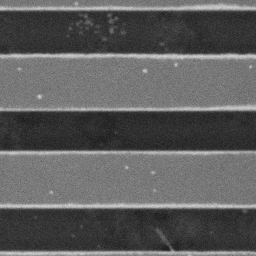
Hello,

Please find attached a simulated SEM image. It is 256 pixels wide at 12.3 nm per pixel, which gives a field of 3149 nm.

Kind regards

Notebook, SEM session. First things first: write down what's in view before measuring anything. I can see lines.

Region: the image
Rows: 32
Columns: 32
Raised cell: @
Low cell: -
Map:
@@@@@@@@@@@@@@@@@@@@@@@@@@@@@@@@
--------------------------------
--------------------------------
--------------------------------
--------------------------------
--------------------------------
--------------------------------
@@@@@@@@@@@@@@@@@@@@@@@@@@@@@@@@
@@@@@@@@@@@@@@@@@@@@@@@@@@@@@@@@
@@@@@@@@@@@@@@@@@@@@@@@@@@@@@@@@
@@@@@@@@@@@@@@@@@@@@@@@@@@@@@@@@
@@@@@@@@@@@@@@@@@@@@@@@@@@@@@@@@
@@@@@@@@@@@@@@@@@@@@@@@@@@@@@@@@
@@@@@@@@@@@@@@@@@@@@@@@@@@@@@@@@
--------------------------------
--------------------------------
--------------------------------
--------------------------------
--------------------------------
@@@@@@@@@@@@@@@@@@@@@@@@@@@@@@@@
@@@@@@@@@@@@@@@@@@@@@@@@@@@@@@@@
@@@@@@@@@@@@@@@@@@@@@@@@@@@@@@@@
@@@@@@@@@@@@@@@@@@@@@@@@@@@@@@@@
@@@@@@@@@@@@@@@@@@@@@@@@@@@@@@@@
@@@@@@@@@@@@@@@@@@@@@@@@@@@@@@@@
@@@@@@@@@@@@@@@@@@@@@@@@@@@@@@@@
--------------------------------
--------------------------------
--------------------------------
--------------------------------
--------------------------------
---------------------@----------